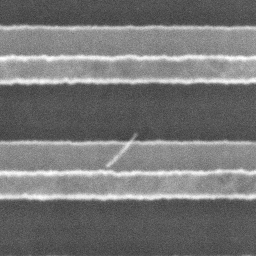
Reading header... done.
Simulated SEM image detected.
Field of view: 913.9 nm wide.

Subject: lines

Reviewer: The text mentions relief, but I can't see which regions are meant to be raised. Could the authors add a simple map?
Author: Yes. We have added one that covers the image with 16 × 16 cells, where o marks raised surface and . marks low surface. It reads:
................
................
oooooooooooooooo
oooooooooooooooo
oooooooooooooooo
................
................
................
................
oooooooooooooooo
oooooooooooooooo
oooooooooooooooo
................
................
................
................